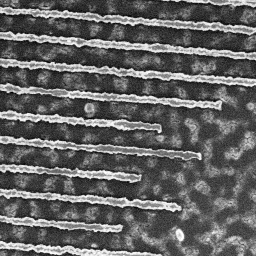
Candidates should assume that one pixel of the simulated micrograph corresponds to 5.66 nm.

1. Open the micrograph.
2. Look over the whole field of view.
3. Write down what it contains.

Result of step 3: parallel lines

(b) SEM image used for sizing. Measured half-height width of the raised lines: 34.6 nm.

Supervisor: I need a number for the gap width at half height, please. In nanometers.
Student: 113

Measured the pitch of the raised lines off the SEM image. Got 0.147 um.